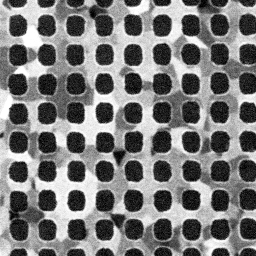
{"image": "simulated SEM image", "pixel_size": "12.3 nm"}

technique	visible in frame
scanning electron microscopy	a regular array of holes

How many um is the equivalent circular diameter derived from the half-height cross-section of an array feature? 0.275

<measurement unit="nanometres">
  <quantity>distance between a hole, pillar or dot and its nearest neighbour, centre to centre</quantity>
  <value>351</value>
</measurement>